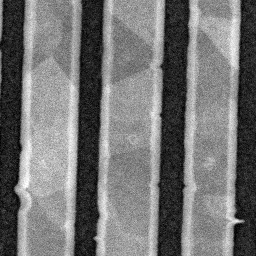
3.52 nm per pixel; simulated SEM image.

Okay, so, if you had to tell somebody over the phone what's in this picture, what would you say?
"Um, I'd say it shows one or a few lines or trenches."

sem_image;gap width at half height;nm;102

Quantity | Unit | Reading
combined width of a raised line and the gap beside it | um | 0.285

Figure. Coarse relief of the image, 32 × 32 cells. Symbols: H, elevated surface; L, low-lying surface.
LLLLHHHHHHLLLHHHHHHHLLLLHHHHHHLL
LLLHHHHHHHLLLHHHHHHHLLLLHHHHHHLL
LLLHHHHHHHLLLHHHHHHHLLLLHHHHHHLL
LLLHHHHHHHLLLHHHHHHHLLLLHHHHHHLL
LLLHHHHHHHLLLHHHHHHHLLLLHHHHHHLL
LLLHHHHHHHLLLHHHHHHHLLLLHHHHHLLL
LLLHHHHHHHLLLHHHHHHHLLLLHHHHHLLL
LLLHHHHHHHLLLHHHHHHHLLLLHHHHHLLL
LLLHHHHHHHLLLHHHHHHHLLLLHHHHHLLL
LLLHHHHHHHLLLHHHHHHHLLLLHHHHHLLL
LLLHHHHHHLLLLHHHHHHHLLLLHHHHHLLL
LLLHHHHHHLLLLHHHHHHHLLLLHHHHHLLL
LLLHHHHHHLLLLHHHHHHHLLLLHHHHHLLL
LLLHHHHHHLLLLHHHHHHHLLLLHHHHHLLL
LLLHHHHHHLLLLHHHHHHHLLLLHHHHHLLL
LLLHHHHHHLLLLHHHHHHHLLLHHHHHHLLL
LLLHHHHHHLLLLHHHHHHHLLLHHHHHHLLL
LLLHHHHHHLLLLHHHHHHHLLLHHHHHHLLL
LLLHHHHHHLLLLHHHHHHHLLLHHHHHHLLL
LLLHHHHHHLLLLHHHHHHHLLLHHHHHHLLL
LLLHHHHHHLLLLHHHHHHHLLLHHHHHHLLL
LLLHHHHHHLLLLHHHHHHHLLLHHHHHHLLL
LLLHHHHHHLLLLHHHHHHHLLLHHHHHHLLL
LLHHHHHHHLLLLHHHHHHLLLLHHHHHHLLL
LLLHHHHHHLLLLHHHHHHLLLLHHHHHHLLL
LLLHHHHHHLLLLHHHHHHLLLLHHHHHHLLL
LLLHHHHHHLLLLHHHHHHLLLLHHHHHHLLL
LLLHHHHHHLLLLHHHHHHLLLLHHHHHHHLL
LLLHHHHHHLLLLHHHHHHLLLLHHHHHHLLL
LLLHHHHHHLLLHHHHHHHLLLLHHHHHHLLL
LLLHHHHHHLLLHHHHHHHLLLLHHHHHHLLL
LLLHHHHHHLLLHHHHHHHLLLLHHHHHHLLL